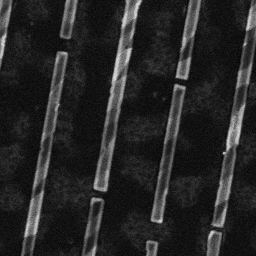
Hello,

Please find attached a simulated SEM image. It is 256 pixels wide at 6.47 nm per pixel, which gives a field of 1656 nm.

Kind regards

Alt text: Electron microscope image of one or a few lines or trenches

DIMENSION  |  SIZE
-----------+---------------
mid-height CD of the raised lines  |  61.4 nanometres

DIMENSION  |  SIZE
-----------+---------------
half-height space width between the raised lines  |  329 nanometres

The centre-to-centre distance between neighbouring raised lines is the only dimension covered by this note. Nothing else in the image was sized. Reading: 60.9 px